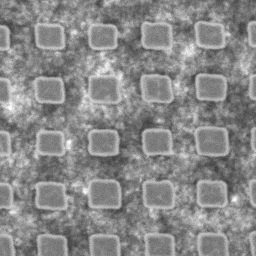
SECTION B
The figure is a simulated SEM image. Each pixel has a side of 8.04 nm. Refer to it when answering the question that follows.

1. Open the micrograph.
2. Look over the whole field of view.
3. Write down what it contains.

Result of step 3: a regular array of raised bodies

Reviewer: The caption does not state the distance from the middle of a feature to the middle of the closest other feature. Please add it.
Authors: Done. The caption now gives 52.6 pixels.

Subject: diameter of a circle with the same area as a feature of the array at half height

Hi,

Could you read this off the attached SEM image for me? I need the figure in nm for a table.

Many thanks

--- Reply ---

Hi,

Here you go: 241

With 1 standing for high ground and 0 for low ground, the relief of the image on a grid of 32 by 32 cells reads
00000000000000000000000000000000
00000000000000000000000000000000
00000000000000000000000000000000
10001111000111000011100011110001
10000111000111100011100001110001
10000111000111100011100001110001
00000000000000000000000000000000
00000000000000000000000000000000
00000000000000000000000000000000
00000000000001000011100001100000
10001111000111100011100001110001
10001111000111100011110001110001
10000111000111100011100000110000
00000000000000000000000000000000
00000000000000000000000000000000
00000000000000000000000000000000
10000110000111000011100011110001
10000111000111100011100011110000
10000111000111100011100001110000
00000000000000000000000000000000
00000000000000000000000000000000
00000000000000000000000000000000
00000000000010000000000000000000
10000111000111100011110001110001
11000111000111100011110001110001
11000111000111100011110001110000
00000000000000000000000000000000
00000000000000000000000000000000
00000000000000000000000000000000
10000111000011000011100001110001
11000111000111100011110001110001
11000111000111100011110001110000